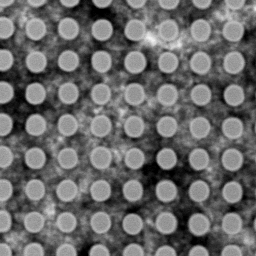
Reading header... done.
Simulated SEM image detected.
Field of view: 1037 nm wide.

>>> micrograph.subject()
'a regular array of raised bodies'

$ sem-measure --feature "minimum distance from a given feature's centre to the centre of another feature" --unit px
32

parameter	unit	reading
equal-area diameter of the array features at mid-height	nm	83.4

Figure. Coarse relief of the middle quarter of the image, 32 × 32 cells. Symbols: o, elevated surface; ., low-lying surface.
ooo....ooooo...ooooo....oooo....
oo......ooo.....oooo....oooo....
................................
................................
................................
ooo.....ooo.....ooo......oo.....
ooo....oooo.....oooo....oooo....
ooo....oooo....ooooo....oooo....
ooo....oooo....ooooo....oooo....
oo......ooo.....ooo.....oooo....
................................
................................
................................
ooo....oooo.....ooo.....ooo.....
ooo....ooooo...ooooo....oooo....
ooo....ooooo...ooooo...ooooo...o
ooo....ooooo...ooooo...ooooo...o
oo......ooo.....ooo.....ooo.....
................................
................................
................................
oo.....oooo.....ooo......oo.....
ooo....ooooo....oooo....oooo....
ooo....ooooo...ooooo...ooooo...o
ooo....ooooo...ooooo...ooooo...o
ooo.....ooo.....ooo.....ooo.....
................................
................................
................................
oo......ooo.....ooo.....ooo.....
ooo....oooo....oooo....ooooo....
ooo....oooo....oooo....ooooo...o